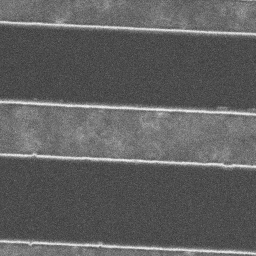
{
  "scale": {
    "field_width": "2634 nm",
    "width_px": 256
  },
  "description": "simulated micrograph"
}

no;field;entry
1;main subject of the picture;one or a few lines or trenches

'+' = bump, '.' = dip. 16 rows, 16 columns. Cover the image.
................
+++.............
++++++++++++++++
++++++++++++++++
++++++++++++++++
++++++++++++++++
...+++++++++++++
................
................
................
++++++++++++++++
++++++++++++++++
++++++++++++++++
++++++++++++++++
++++++++++++++++
.........+++++++